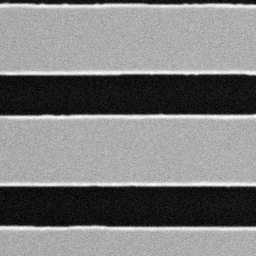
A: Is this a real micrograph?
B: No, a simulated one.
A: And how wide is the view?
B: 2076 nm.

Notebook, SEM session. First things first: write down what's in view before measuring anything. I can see lines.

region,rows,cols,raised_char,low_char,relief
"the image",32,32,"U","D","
DDDDDDDDDDDDDDDDDDDDDDDDDDDDDDDD
UUUUUUUUUUUUUUUUUUUUUUUUUUUUUUUU
UUUUUUUUUUUUUUUUUUUUUUUUUUUUUUUU
UUUUUUUUUUUUUUUUUUUUUUUUUUUUUUUU
UUUUUUUUUUUUUUUUUUUUUUUUUUUUUUUU
UUUUUUUUUUUUUUUUUUUUUUUUUUUUUUUU
UUUUUUUUUUUUUUUUUUUUUUUUUUUUUUUU
UUUUUUUUUUUUUUUUUUUUUUUUUUUUUUUU
UUUUUUUUUUUUUUUUUUUUUUUUUUUUUUUU
DDDDDDDDDDDDDDDDDDDDDDDDDDDDDDDD
DDDDDDDDDDDDDDDDDDDDDDDDDDDDDDDD
DDDDDDDDDDDDDDDDDDDDDDDDDDDDDDDD
DDDDDDDDDDDDDDDDDDDDDDDDDDDDDDDD
DDDDDDDDDDDDDDDDDDDDDDDDDDDDDDDD
DDDDDUUDDUUUUUUUUUUUUUUUUUUUUUUU
UUUUUUUUUUUUUUUUUUUUUUUUUUUUUUUU
UUUUUUUUUUUUUUUUUUUUUUUUUUUUUUUU
UUUUUUUUUUUUUUUUUUUUUUUUUUUUUUUU
UUUUUUUUUUUUUUUUUUUUUUUUUUUUUUUU
UUUUUUUUUUUUUUUUUUUUUUUUUUUUUUUU
UUUUUUUUUUUUUUUUUUUUUUUUUUUUUUUU
UUUUUUUUUUUUUUUUUUUUUUUUUUUUUUUU
UUUUUUUUUUUUUUUUUUUUUUUUUUUUUUUU
DDDDDDDDDDDDDDDDDDDDDDDDDDDDDDDD
DDDDDDDDDDDDDDDDDDDDDDDDDDDDDDDD
DDDDDDDDDDDDDDDDDDDDDDDDDDDDDDDD
DDDDDDDDDDDDDDDDDDDDDDDDDDDDDDDD
DDDDDDDDDDDDDDDDDDDDDDDDDDDDDDDD
UUUUUUUUUUUUUUUUUUUUUUUUUUUUUUUU
UUUUUUUUUUUUUUUUUUUUUUUUUUUUUUUU
UUUUUUUUUUUUUUUUUUUUUUUUUUUUUUUU
UUUUUUUUUUUUUUUUUUUUUUUUUUUUUUUU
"